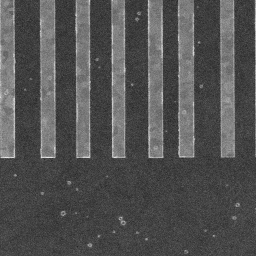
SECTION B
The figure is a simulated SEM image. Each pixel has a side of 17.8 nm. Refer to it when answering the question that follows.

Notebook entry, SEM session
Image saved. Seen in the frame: parallel lines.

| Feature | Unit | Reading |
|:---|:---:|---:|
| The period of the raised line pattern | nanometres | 643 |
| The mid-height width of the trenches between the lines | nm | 402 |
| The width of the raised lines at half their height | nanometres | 250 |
